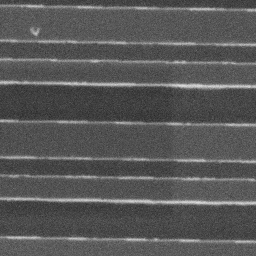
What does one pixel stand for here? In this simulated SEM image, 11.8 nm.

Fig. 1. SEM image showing lines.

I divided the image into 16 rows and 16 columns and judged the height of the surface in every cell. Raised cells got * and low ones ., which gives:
*********.......
****************
****************
****************
****************
................
................
................
****************
****************
****************
****************
......**********
................
................
****************